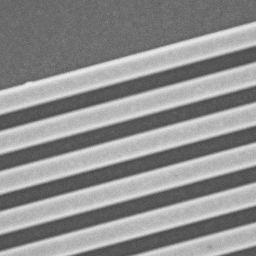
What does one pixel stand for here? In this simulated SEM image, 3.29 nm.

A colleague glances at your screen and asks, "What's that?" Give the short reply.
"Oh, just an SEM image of parallel lines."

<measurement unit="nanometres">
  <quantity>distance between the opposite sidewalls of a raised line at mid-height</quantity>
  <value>73.1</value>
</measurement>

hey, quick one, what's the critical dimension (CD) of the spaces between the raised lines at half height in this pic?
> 55.6 nanometers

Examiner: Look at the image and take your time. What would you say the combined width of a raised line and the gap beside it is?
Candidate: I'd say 38.7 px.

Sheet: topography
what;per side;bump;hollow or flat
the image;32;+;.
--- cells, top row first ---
................................
................................
................................
.............................+++
..........................++++++
......................++++++++++
..................+++++++++++...
...............++++++++++.......
...........+++++++++++........++
.......+++++++++++........++++++
...+++++++++++........++++++++++
++++++++++.........++++++++++...
+++++++........++++++++++.......
+++........++++++++++........+++
.......+++++++++++........++++++
...+++++++++++........++++++++++
++++++++++........+++++++++++...
+++++++........++++++++++.......
+++........+++++++++++........++
.......+++++++++++........++++++
....++++++++++........++++++++++
++++++++++.........++++++++++...
+++++++........++++++++++.......
+++........++++++++++.........++
........++++++++++........++++++
....++++++++++........++++++++++
++++++++++........+++++++++++...
+++++++........++++++++++.......
+++........+++++++++++........++
.......+++++++++++........++++++
....++++++++++........++++++++++
+++++++++++........++++++++++...